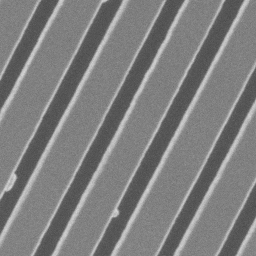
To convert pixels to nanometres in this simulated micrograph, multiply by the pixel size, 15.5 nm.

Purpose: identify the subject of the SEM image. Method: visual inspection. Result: lines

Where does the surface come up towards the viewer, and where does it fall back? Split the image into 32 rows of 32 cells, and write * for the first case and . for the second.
*****..******..*****...*****..**
****...*****...*****..*****...**
****..******..*****...*****..***
***...*****...*****..*****...***
***..******..*****...*****..****
**...*****...*****..*****...****
**..******..*****...*****..*****
*...*****...*****..*****...*****
*..******..*****...*****..******
...*****...*****..*****...*****.
..*****...*****...*****..******.
..*****...*****..*****...*****..
.*****...*****...*****..******..
******...*****..*****...*****...
*****...*****...*****..******..*
*****..******..*****...*****...*
****...*****...*****..******..**
****..******..*****...*****...**
***...*****...****...******..***
***..******..*****...*****..****
**...*****...****...******..****
**..******..*****..******..*****
**..*****...****...******..*****
*..******..*****..******..******
...*****..*****...*****...*****.
..*****...*****..******..******.
..*****..*****...*****...*****..
.*****...*****..******..*****...
.*****..*****...*****...*****..*
*****...*****..******..*****...*
*****..*****...*****...*****..**
****...*****..******..*****...**